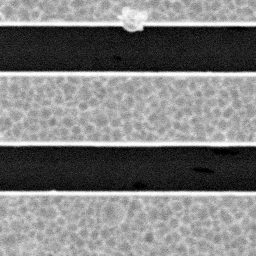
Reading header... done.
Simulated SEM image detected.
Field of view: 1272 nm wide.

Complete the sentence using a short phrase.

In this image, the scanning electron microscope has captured one or a few lines or trenches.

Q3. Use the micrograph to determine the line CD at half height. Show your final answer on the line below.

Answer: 347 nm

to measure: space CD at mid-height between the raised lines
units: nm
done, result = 247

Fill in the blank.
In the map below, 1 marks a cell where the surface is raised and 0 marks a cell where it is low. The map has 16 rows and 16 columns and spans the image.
1111111111111111
0000000110000001
0000000000000000
0000000000000000
0000000000000000
1111111111111111
1111111111111111
1111111111111111
1111111111111111
0000000000000000
0000000000000000
0000000000000000
1111111111111111
1111111111111111
1111111111111111
1111111111111111